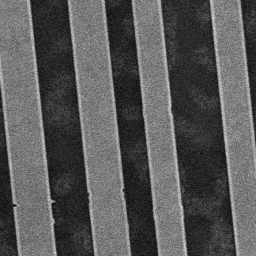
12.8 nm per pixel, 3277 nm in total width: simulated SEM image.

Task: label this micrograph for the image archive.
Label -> one or a few lines or trenches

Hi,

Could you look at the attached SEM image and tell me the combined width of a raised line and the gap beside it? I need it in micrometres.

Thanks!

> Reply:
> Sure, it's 0.884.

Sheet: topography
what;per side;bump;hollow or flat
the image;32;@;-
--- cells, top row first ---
@@@@-----@@@@----@@@------@@@@--
@@@@-----@@@@----@@@-------@@@--
@@@@-----@@@@----@@@-------@@@--
@@@@-----@@@@----@@@-------@@@--
@@@@-----@@@@----@@@-------@@@--
@@@@-----@@@@----@@@-------@@@--
@@@@-----@@@@@---@@@@------@@@@-
@@@@-----@@@@@---@@@@------@@@@-
@@@@-----@@@@@---@@@@------@@@@-
@@@@@-----@@@@----@@@------@@@@-
@@@@@-----@@@@----@@@-------@@@-
@@@@@-----@@@@----@@@-------@@@-
@@@@@-----@@@@----@@@-------@@@-
-@@@@-----@@@@----@@@-------@@@-
-@@@@-----@@@@----@@@-------@@@-
-@@@@-----@@@@@---@@@-------@@@@
-@@@@-----@@@@@---@@@@------@@@@
-@@@@-----@@@@@---@@@@------@@@@
-@@@@------@@@@----@@@------@@@@
-@@@@@-----@@@@----@@@------@@@@
-@@@@@-----@@@@----@@@-------@@@
-@@@@@-----@@@@----@@@-------@@@
-@@@@@-----@@@@----@@@-------@@@
--@@@@-----@@@@----@@@-------@@@
--@@@@-----@@@@----@@@-------@@@
--@@@@-----@@@@@---@@@@------@@@
--@@@@-----@@@@@---@@@@------@@@
--@@@@-----@@@@@---@@@@------@@@
--@@@@------@@@@----@@@------@@@
--@@@@@-----@@@@----@@@-------@@
--@@@@@-----@@@@----@@@-------@@
--@@@@@-----@@@@----@@@-------@@